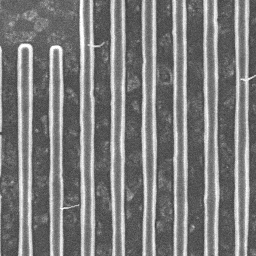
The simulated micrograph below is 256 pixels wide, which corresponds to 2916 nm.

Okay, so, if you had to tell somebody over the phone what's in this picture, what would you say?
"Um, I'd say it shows parallel lines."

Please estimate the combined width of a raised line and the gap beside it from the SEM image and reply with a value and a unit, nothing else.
353 nanometres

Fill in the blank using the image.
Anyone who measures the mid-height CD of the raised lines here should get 10.9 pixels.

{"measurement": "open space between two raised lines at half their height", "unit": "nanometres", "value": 238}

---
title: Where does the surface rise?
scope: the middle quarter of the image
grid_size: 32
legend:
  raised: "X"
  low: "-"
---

-----XX-----XXX-----XX------XX--
-----XX-----XXX-----XX------XX--
-----XX-----XXX-----XX------XX--
-----XX-----XXX-----XX------XX--
-----XX-----XXX-----XX------XX--
-----XX-----XXX-----XX------XX--
-----XX-----XXX-----XX------XX--
-----XX-----XXX-----XX------XX--
-----XX-----XXX-----XX------XX--
-----XX-----XXX-----XX------XX--
-----XX-----XXX-----XX------XX--
-----XX-----XXX-----XX------XX--
-----XX-----XXX-----XX------XX--
----XXX-----XXX-----XX------XX--
----XXX-----XXX-----XX------XX--
-----XX-----XXX-----XX------XX--
-----XX-----XXX-----XX------XX--
-----XX-----XXX-----XX------XX--
-----XX-----XXX-----XXX-----XX--
-----XX-----XXX-----XXX-----XX--
-----XX-----XXX-----XXX-----XX--
-----XX-----XXX-----XXX-----XX--
-----XX-----XXX-----XXX-----XX--
-----XX-----XXX-----XXX-----XX--
-----XX-----XXX-----XXX-----XX--
-----XX-----XXX-----XXX-----XX--
-----XX-----XXX-----XXX-----XX--
-----XX-----XXX-----XXX-----XX--
-----XX-----XXX-----XXX-----XX--
-----XX-----XXX-----XXX-----XX--
-----XX-----XXX-----XXX-----XX--
-----XX-----XXX-----XXX-----XX--